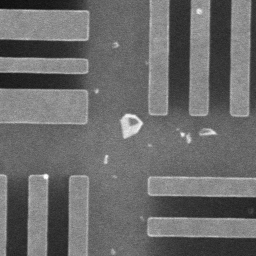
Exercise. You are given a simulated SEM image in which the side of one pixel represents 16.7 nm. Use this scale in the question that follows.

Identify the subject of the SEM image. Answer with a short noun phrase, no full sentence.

groups of lines, slits or small figures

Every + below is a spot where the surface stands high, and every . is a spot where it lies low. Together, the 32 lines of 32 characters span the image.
...................++...++...++.
+++++++++++........++...++...++.
+++++++++++........++...++...++.
+++++++++++........++...++...++.
+++++++++++........++...++...++.
...................++...++...++.
...................++...++...++.
+++++++++++........++...++...++.
+++++++++++........++...++...++.
...................++...++...++.
...................++...++...++.
+++++++++++........++...++...++.
+++++++++++........++...++...++.
+++++++++++........++...++...++.
+++++++++++..................++.
................................
................................
................................
................................
................................
................................
................................
+...++...++........+++++++++++++
+...++...++........+++++++++++++
+...++...++..............+++++++
+...++...++.....................
+...++...++.....................
+...++...++........+++++++++++++
+...++...++.......++++++++++++++
+...++...++............+++++++++
+..+++...++.....................
+..+++...++.....................